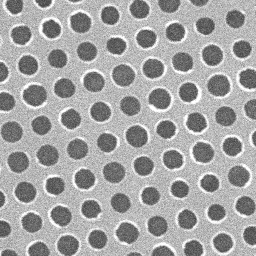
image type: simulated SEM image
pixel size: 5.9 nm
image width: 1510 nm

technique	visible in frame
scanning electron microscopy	a regular array of holes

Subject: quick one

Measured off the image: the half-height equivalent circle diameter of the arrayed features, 0.123 um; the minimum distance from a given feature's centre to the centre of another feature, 178 nm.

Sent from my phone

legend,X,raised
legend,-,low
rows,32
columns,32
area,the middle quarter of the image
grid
XXXXXXXXXXXXX----XX------XX-----
XXXXXXXXXXXX-----XXX-----XXX----
XXXXX----XXX------XX-----XXXXXXX
-XXXX-----XX------XXX--XXXXXXXXX
--XXX-----XXX-----XXXXXXXXXXXXX-
---XX-----XXX---XXXXXXXXXXXXX---
---XXX----XXXXXXXXXXXX----XXX---
---XXXXXXXXXXXXXXXXXX-----XXX---
-XXXXXXXXXXXXXX---XXX------XX---
XXXXXXXX--XXXX-----XX------XXX--
XXXXXXX----XXX-----XXX----XXXXXX
X--XXX------XX-----XXXXXXXXXXXXX
----XXX-----XXX----XXXXXXXXXXXX-
----XXX----XXXXXXXXXXXXXXXXXXXX-
----XXXXX-XXXXXXXXXXXXXX---XXX--
----XXXXXXXXXXXXX--XXXX-----XXX-
X-XXXXXXXXXXXXXX-----XX-----XXX-
XXXXXXXXX---XXX------XX-----XXXX
XXX-XXXX-----XX------XXX---XXXXX
X----XXX-----XXX-----XXXXXXXXXXX
X-----XX-----XXXX---XXXXXXXXXXXX
------XXX---XXXXXXXXXXXXXXX-XXXX
X-----XXXXXXXXXXXXXXXXXXX----XXX
XX---XXXXXXXXXXXXX---XXXX-----XX
XXXXXXXXXXX--XXXX-----XXX-----XX
XXXXXXXXXX-----XX------XX-----XX
XXXX---XXX-----XXX----XXXXXXXXXX
XXX----XXX-----XXX----XXXXXXXXXX
XXX-----XX-----XXXXXXXXXXXXXXXXX
XXX-----XXX---XXXXXXXXXXXXX---XX
XXX----XXXXXXXXXXXXXXXXXXXX----X
XXXXX-XXXXXXXXXXXXXX---XXXX----X